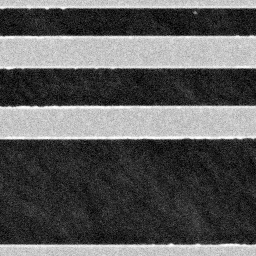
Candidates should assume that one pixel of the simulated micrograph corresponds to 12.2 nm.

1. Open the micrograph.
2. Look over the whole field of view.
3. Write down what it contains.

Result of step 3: lines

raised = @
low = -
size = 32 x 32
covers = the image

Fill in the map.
@@@@@@@@@@@@@@@@@@@@@@@@@@@@@@@@
--------------------------------
--------------------------------
--------------------------------
-----------------------------@-@
@@@@@@@@@@@@@@@@@@@@@@@@@@@@@@@@
@@@@@@@@@@@@@@@@@@@@@@@@@@@@@@@@
@@@@@@@@@@@@@@@@@@@@@@@@@@@@@@@@
@@-------@----@-----------------
--------------------------------
--------------------------------
--------------------------------
--------------------------------
@@@@@@@@@@@@@@@@@@@@@@@@@@@@@@@@
@@@@@@@@@@@@@@@@@@@@@@@@@@@@@@@@
@@@@@@@@@@@@@@@@@@@@@@@@@@@@@@@@
@@@@@@@@@@@@@@@@@@@@@@@@@@@@@@@@
--------------------------------
--------------------------------
--------------------------------
--------------------------------
--------------------------------
--------------------------------
--------------------------------
--------------------------------
--------------------------------
--------------------------------
--------------------------------
--------------------------------
--------------------------------
--------------------------------
@@@@@@@@@@@@@@@@@@@@@@@@@@@@@@@@